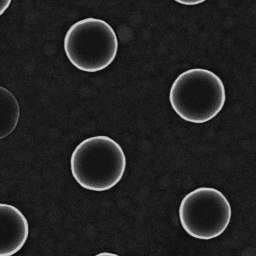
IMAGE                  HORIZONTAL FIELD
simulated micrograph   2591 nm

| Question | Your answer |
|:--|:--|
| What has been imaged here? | raised bodies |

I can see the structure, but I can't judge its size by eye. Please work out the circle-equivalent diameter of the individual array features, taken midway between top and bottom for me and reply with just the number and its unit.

524 nm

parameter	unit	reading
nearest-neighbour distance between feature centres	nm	1190